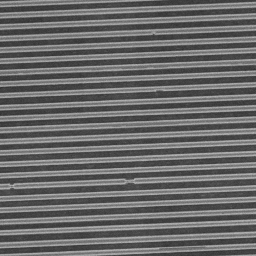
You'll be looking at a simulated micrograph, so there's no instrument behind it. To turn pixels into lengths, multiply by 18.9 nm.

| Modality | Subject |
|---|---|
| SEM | parallel lines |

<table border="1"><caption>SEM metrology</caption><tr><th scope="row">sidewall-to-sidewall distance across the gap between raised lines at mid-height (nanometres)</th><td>144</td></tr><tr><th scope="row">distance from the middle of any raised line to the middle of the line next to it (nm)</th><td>217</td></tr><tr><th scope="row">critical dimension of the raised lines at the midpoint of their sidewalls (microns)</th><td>0.0709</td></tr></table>